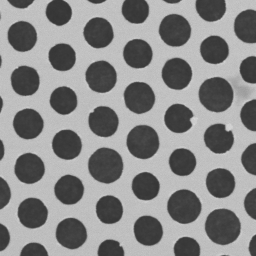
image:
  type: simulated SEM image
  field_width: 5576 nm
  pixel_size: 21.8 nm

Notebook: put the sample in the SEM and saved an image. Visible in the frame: a regular array of holes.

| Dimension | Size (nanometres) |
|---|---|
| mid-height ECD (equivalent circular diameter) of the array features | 656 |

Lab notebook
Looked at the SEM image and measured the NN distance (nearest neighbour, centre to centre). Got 943 nm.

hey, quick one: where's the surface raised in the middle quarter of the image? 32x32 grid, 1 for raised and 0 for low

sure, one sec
00111100000011110000011110000000
01111100000001111111111100000000
11111000000001111111111100000000
11111000000001111111111110000000
11111100000001111101111110000000
11111100000001110000011111000001
00111110000011100000001111111111
00011111111111100000000111111111
00011111111111100000000111111111
00011111111111100000000111111111
00011111111111110000001111100011
00011110000011110000011111000000
01111100000001111101111110000000
11111100000000111111111110000000
11111100000000111111111110000000
11111100000001111100011111000000
00111110000001111000000111000001
00011111000011110000000111111111
00001111111111110000000011111111
00001111111111110000000011111111
00000111111111110000000011111111
00001111000001110000000111110001
00001110000000111000000111100000
00011100000000111100011111000000
11111100000000011111111111000000
11111100000000011111111111000000
11111100000000011111111111100000
11111110000000111110001111110000
00011110000000111000000111111111
00001111100011111000000011111111
00000111111111111000000011111111
00000111111111111000000011111001